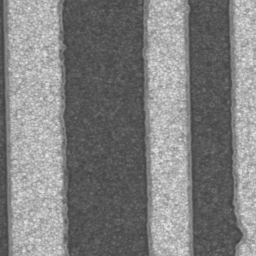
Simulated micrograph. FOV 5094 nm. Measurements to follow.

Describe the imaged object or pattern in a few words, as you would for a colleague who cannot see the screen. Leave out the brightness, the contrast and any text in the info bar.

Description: one or a few lines or trenches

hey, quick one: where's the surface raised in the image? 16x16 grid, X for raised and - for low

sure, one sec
----XXXXX---XX--
----XXXXX---XX--
----XXXXX---XX--
----XXXXX---XX--
----XXXXX---XXX-
----XXXXX---XXX-
----XXXXX---XXX-
----XXXXX---XXX-
----XXXXX---XXX-
----XXXXX---XXX-
X---XXXXX---XXX-
----XXXXX---XXX-
X---XXXXX---XXX-
X---XXXXX---XXX-
X---XXXXX---XXX-
X---XXXXX---XXX-